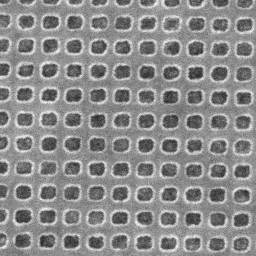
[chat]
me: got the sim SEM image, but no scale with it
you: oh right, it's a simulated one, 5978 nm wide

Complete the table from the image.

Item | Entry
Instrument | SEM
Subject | a regular array of holes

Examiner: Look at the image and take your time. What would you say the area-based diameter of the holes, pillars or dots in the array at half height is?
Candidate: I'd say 368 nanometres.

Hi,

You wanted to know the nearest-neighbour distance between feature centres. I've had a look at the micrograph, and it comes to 557 nanometers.